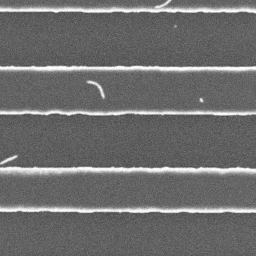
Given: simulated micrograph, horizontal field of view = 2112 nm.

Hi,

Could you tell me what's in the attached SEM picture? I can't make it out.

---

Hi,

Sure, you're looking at lines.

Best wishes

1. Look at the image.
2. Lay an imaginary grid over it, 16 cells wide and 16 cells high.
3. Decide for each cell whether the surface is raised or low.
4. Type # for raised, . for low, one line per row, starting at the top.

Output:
################
................
................
................
################
################
################
................
................
................
................
################
################
................
................
................